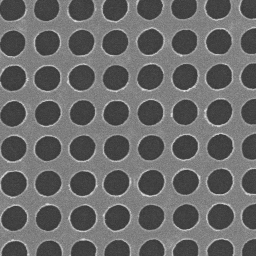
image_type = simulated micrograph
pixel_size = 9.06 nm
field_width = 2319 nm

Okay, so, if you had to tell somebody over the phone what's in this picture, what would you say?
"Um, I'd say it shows a regular array of holes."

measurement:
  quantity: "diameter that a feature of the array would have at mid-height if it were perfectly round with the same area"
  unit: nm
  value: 232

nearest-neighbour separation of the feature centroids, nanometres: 310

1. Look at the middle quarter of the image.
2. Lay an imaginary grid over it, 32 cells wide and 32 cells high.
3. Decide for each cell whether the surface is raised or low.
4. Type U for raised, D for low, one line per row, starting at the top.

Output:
UUUDDDUUUUUUDDUUUUUUDDDDUUUUUDDD
UUDDDDDUUUUDDDDDUUUDDDDDDUUUDDDD
UDDDDDDDUUDDDDDDUUUDDDDDDUUDDDDD
UDDDDDDDUDDDDDDDUUDDDDDDDUUDDDDD
UDDDDDDUUUDDDDDDUUDDDDDDDUUDDDDD
UUDDDDDUUUDDDDDUUUUDDDDDUUUUDDDD
UUUUDUUUUUUUDDUUUUUUUUUUUUUUUUDU
UUUUUUUUUUUUUUUUUUUUUUUUUUUUUUUU
UUUUUUUUUUUUUUUUUUUUUUUUUUUUUUUU
UUUDDDDUUUUDDDDUUUUUDDDUUUUUUDDD
UUDDDDDUUUUDDDDDUUUDDDDDUUUUDDDD
UUDDDDDDUUDDDDDDUUUDDDDDDUUDDDDD
UDDDDDDDUUDDDDDDUUDDDDDDDUUDDDDD
UUDDDDDUUUDDDDDDUUUDDDDDDUUDDDDD
UUDDDDDUUUUDDDDUUUUDDDDDUUUUDDDD
UUUUUUUUUUUUUUUUUUUUUDUUUUUUUUUU
UUUUUUUUUUUUUUUUUUUUUUUUUUUUUUUU
UUUUUUUUUUUUUUUUUUUUUUUUUUUUUUUU
UUUDDDDUUUUDDDDDUUUUDDDDUUUUUDDD
UUDDDDDUUUDDDDDDUUUDDDDDDUUUDDDD
UDDDDDDDUUDDDDDDUUUDDDDDDUUDDDDD
UDDDDDDDUUDDDDDDUUUDDDDDDUUDDDDD
UUDDDDDUUUDDDDDDUUUDDDDDUUUDDDDD
UUDDDDDUUUUDDDDUUUUUDDDUUUUUDDDD
UUUUUUUUUUUUUUUUUUUUUUUUUUUUUUUU
UUUUUUUUUUUUUUUUUUUUUUUUUUUUUUUU
UUUUUUUUUUUUUDUUUUUUUUUUUUUUUUDU
UUUDDDDUUUUDDDDUUUUUDDDDUUUUDDDD
UUDDDDDDUUDDDDDDUUUDDDDDDUUDDDDD
UUDDDDDDUUDDDDDDUUUDDDDDDUUDDDDD
UUDDDDDDUUDDDDDDUUUDDDDDDUUDDDDD
UUDDDDDDUUDDDDDDUUUDDDDDUUUUDDDD